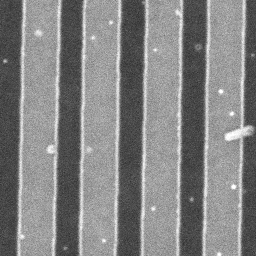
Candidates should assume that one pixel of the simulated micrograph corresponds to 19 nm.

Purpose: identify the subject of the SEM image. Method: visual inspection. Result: lines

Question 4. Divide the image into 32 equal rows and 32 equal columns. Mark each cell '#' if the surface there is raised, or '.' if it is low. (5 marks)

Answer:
###....####....###.....###.....#
###....####....###.....###.....#
###....####....###.....###.....#
###....####....###.....###....##
###....####....###.....###....##
###....####....###.....###....##
###....####....###.....###....##
###....####....###.....###....##
###....###.....###.....###....##
###....###.....###.....###....##
###....###.....###.....###....##
###....###.....###....####....##
###....###.....###....####....##
###....###.....###....####....##
###....###.....###....####....##
###....###.....###....####....##
###....###.....###....####...###
###....###.....###....####....##
###...####.....###....####....##
###....###.....###....####....##
###....###.....###....####....##
###....###.....###....####....##
###....###.....###....####....##
###....###.....###....####....##
###....###.....###....####....##
##.....###.....###....####....##
##.....###.....###....####....##
##.....###.....###....####....##
##.....###.....###....####....##
##.....###.....###....####....##
##.....###....####....####....##
##.....###....####....####....##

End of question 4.